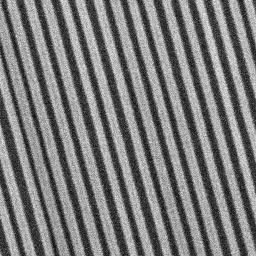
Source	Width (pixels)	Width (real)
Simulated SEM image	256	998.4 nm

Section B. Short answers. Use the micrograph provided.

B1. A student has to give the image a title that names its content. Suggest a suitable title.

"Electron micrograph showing parallel lines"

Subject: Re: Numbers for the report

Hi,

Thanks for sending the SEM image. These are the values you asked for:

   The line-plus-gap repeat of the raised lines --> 63.7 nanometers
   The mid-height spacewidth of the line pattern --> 32.4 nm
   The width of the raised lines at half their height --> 8.18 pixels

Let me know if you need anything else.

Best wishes